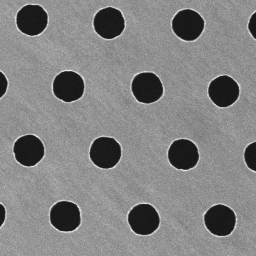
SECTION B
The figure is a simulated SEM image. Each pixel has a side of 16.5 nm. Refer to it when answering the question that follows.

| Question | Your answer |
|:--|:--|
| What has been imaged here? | a regular array of holes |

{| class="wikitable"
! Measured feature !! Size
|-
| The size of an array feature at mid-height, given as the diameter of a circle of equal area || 513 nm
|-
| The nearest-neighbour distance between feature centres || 1.24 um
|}